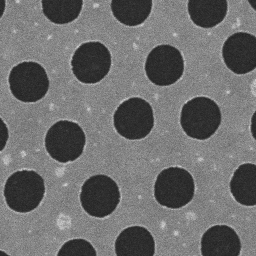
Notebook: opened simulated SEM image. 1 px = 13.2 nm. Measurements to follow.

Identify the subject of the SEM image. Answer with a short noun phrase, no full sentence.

a regular array of holes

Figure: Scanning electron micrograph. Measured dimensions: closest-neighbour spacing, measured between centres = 850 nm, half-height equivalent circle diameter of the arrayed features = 550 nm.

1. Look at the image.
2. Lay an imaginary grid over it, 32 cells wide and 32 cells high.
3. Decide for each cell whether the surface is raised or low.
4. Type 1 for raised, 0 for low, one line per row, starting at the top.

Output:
01111000001111000001111000001110
11111000001111000001111100001111
11111100011111100011111100001111
11111111111111111111111111111111
11111111111111111111111111111000
11111111110001111111111111110000
11111111100000111110001111110000
11111111100000111100000111110000
11000111100000111100000111111000
10000011100001111100000111111111
10000011111111111110001111111111
10000011111111111111111111111111
11000111111111110011111100111111
11111111111111100001111000011111
11111111111111000001111000001111
01111110001111000001111000011110
01111100001111100001111000011110
01111100000111111111111111111111
11111100001111111111111111111111
11111100001111111111111111111111
11111111111111111111111111111100
11001111111111111111000011111000
10000111111000111110000011111000
00000011110000011110000011111000
10000011110000011110000011111000
10000111110000011111000111111100
11001111111000111111111111111111
11111111111111111111111111111111
11111111111111110011111111000111
11111111111111100001111110000011
11111111000111000001111110000011
01111110000011000001111110000011